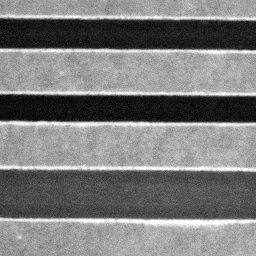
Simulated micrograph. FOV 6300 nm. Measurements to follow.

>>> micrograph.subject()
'lines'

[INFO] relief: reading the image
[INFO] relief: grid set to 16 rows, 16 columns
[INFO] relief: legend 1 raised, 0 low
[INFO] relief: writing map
1111111111111111
0000000000000000
0000000000000000
1111111111111111
1111111111111111
1111111111111111
0000000000000000
0000000000000000
1111111111111111
1111111111111111
1111111111111111
0000000000000000
0000000000000000
0000000000000000
1111111111111111
1111111111111111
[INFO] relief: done